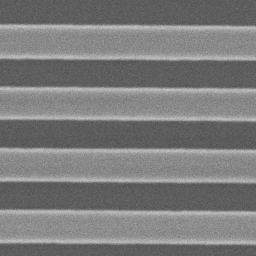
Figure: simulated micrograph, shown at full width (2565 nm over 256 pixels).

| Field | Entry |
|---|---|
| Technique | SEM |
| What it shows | wiring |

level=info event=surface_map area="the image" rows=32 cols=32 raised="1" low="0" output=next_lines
00000000000000000000000000000000
00000000000000000000000000000000
00000000000000000000000000000000
11111111111111111111111111111111
11111111111111111111111111111111
11111111111111111111111111111111
11111111111111111111111111111111
00000000000000000000000000000000
00000000000000000000000000000000
00000000000000000000000000000000
00000000000000000000000000000000
11111111111111111111111111111111
11111111111111111111111111111111
11111111111111111111111111111111
11111111111111111111111111111111
00000000000000000000000000000000
00000000000000000000000000000000
00000000000000000000000000000000
00000000000000000000000000000000
11111111111111111111111111111111
11111111111111111111111111111111
11111111111111111111111111111111
00000011111111111111111111111111
00000000000000000000000000000000
00000000000000000000000000000000
00000000000000000000000000000000
11111111111111111000000000000000
11111111111111111111111111111111
11111111111111111111111111111111
11111111111111111111111111111111
00000000000000000000000000000000
00000000000000000000000000000000